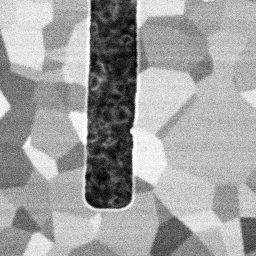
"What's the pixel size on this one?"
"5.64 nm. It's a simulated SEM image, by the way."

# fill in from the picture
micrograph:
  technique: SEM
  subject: one or a few lines or trenches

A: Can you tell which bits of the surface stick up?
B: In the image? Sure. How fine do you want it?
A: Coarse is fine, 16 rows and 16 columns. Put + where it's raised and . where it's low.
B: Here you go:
++++++...+++++++
++++++...+++++++
++++++...+++++++
++++++...+++++++
++++++...+++++++
++++++...+++++++
+++++....+++++++
+++++...++++++++
+++++...++++++++
+++++...++++++++
+++++...++++++++
+++++...++++++++
+++++...++++++++
++++++++++++++++
++++++++++++++++
++++++++++++++++